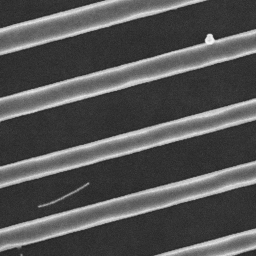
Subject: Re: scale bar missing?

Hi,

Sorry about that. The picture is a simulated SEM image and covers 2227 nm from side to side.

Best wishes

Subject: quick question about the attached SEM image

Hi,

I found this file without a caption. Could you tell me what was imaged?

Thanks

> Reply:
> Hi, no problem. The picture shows lines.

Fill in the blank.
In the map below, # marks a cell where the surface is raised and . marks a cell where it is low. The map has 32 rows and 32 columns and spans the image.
............############........
.........###########............
....############................
.###########....................
#########....................###
#####....................#######
#....................###########
..................##########....
...............##########.......
..........###########...........
.......##########...............
...##########...................
##########......................
######......................####
##......................########
....................##########..
.................#########......
.............#########..........
.........##########.............
......#########.................
.##########....................#
#######....................#####
###.....................########
....................#########...
................#########.......
............##########..........
.........#########..............
.....#########..................
.##########.....................
#######......................###
###......................#######
.....................#########..